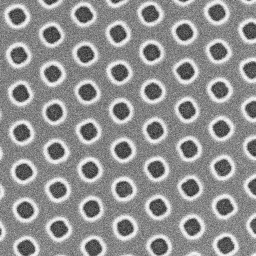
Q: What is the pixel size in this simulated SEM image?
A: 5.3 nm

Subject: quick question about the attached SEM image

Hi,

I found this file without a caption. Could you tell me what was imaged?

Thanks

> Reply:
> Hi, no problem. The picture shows a regular array of holes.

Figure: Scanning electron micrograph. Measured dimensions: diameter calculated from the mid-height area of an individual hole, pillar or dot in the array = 0.0994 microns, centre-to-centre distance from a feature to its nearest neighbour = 202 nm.